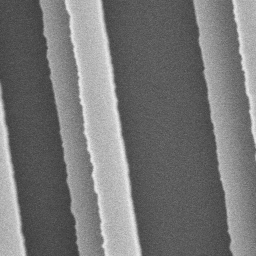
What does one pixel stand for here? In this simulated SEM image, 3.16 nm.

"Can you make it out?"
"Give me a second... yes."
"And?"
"lines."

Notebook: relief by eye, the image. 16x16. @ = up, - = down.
---@@@------@@@@
---@@@@-----@@@@
---@@@@-----@@@@
---@@@@------@@@
---@@@@------@@@
---@@@@------@@@
----@@@------@@@
----@@@------@@@
----@@@@-----@@@
@---@@@@------@@
@---@@@@------@@
@---@@@@------@@
@---@@@@------@@
@----@@@------@@
@----@@@@-----@@
@@---@@@@-----@@